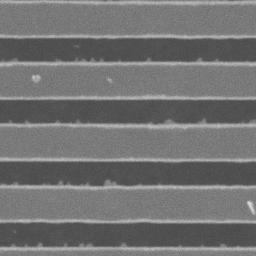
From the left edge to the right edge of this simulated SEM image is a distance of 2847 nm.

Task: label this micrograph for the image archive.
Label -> lines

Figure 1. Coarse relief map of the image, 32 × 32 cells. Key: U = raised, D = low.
UUUUUUUUUUUUUUUUUUUUUUUUUUUUUUUU
UUUUUUUUUUUUUUUUUUUUUUUUUUUUUUUU
UUUUUUUUUUUUUUUUUUUUUUUUUUUUUUUU
UUUUUUUUUUUUUUUUUUUUUUUUUUUUUUUU
UUUUUUUUUUUUUUUUUUUUUUUUUUUUUUUU
DDDDDDDDDDDDDDDDDDDDDDDDDDDDDDDD
DDDDDDDDDDDDDDDDDDDDDDDDDDDDDDDD
DDDDDDDDDDDDDDDDDDDDDDDDDDDDDDDD
UUUUUUUUUUUUUUUUUUUUUUUUUUUUUUUU
UUUUUUUUUUUUUUUUUUUUUUUUUUUUUUUU
UUUUUUUUUUUUUUUUUUUUUUUUUUUUUUUU
UUUUUUUUUUUUUUUUUUUUUUUUUUUUUUUU
DDDDDDDDDDDDDDDDDDDDDDDDDDDDDDDD
DDDDDDDDDDDDDDDDDDDDDDDDDDDDDDDD
DDDDDDDDDDDDDDDDDDDDDDDDDDDDDDDD
DDDDDDDDDDDDDDDDDDDDDDDDDDDDDDDD
UUUUUUUUUUUUUUUUUUUUUUUUUUUUUUUU
UUUUUUUUUUUUUUUUUUUUUUUUUUUUUUUU
UUUUUUUUUUUUUUUUUUUUUUUUUUUUUUUU
UUUUUUUUUUUUUUUUUUUUUUUUUUUUUUUU
DDDDDDDDDDDDDDDDDDDDDDDDDDDDDDDD
DDDDDDDDDDDDDDDDDDDDDDDDDDDDDDDD
DDDDDDDDDDDDDDDDDDDDDDDDDDDDDDDD
UUUUUUUUUUUUUUUUUUUUUUUUUUUUUUUU
UUUUUUUUUUUUUUUUUUUUUUUUUUUUUUUU
UUUUUUUUUUUUUUUUUUUUUUUUUUUUUUUU
UUUUUUUUUUUUUUUUUUUUUUUUUUUUUUUU
UUUUUUUUUUUUUUUUUUUUUUUUUUUUUUUU
DDDDDDDDDDDDDDDDDDDDDDDDDDDDDDDD
DDDDDDDDDDDDDDDDDDDDDDDDDDDDDDDD
DDDDDDDDDDDDDDDDDDDDDDDDDDDDDDDD
UUUUUUUUUUUUUUUUUUUUUUUUUUUUUUUU